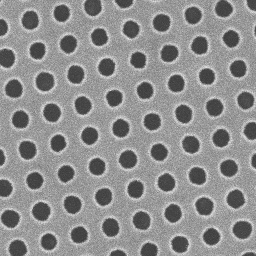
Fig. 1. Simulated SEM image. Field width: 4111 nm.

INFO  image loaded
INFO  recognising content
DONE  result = a regular array of holes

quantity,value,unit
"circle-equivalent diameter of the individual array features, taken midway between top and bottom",0.293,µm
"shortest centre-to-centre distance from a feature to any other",31.2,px